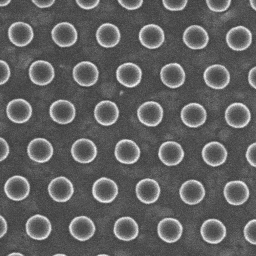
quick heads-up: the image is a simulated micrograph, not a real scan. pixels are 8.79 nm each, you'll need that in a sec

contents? a regular array of raised bodies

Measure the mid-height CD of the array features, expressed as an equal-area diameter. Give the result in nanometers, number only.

210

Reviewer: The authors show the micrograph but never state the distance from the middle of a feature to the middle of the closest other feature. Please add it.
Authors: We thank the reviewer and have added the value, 383 nm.